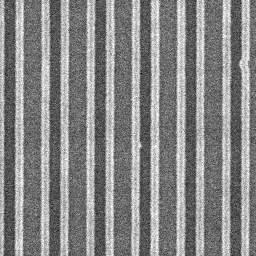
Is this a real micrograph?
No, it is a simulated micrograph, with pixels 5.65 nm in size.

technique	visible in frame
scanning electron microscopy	parallel lines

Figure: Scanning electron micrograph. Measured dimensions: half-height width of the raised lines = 0.0381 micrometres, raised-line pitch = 0.128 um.